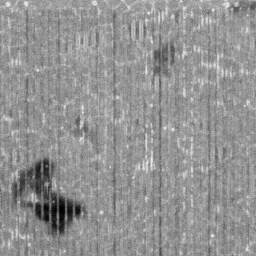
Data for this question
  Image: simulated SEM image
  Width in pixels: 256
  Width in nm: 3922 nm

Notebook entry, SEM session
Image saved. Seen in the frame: parallel lines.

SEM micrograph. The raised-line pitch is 122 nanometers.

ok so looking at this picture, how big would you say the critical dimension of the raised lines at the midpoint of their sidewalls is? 23 nm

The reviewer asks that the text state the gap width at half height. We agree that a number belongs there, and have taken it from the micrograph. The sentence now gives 97.7 nm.